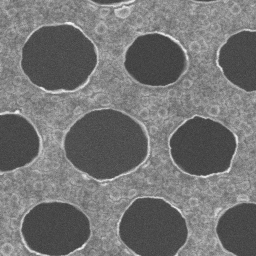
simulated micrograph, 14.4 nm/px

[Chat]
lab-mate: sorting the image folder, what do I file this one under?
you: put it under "holes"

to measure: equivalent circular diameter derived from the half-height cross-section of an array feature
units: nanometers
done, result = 959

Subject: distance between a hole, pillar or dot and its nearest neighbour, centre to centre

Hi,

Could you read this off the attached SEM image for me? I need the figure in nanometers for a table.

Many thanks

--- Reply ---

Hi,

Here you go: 1390